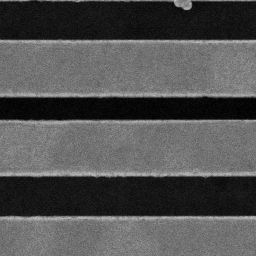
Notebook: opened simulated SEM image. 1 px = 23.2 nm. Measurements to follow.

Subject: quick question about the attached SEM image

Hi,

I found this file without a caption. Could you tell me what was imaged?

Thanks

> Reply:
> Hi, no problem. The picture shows lines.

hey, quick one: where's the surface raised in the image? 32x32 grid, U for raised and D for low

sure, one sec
DDDDDDDDDDDDDDDDDDDDDDUUDDDDDDDD
DDDDDDDDDDDDDDDDDDDDDDDDDDDDDDDD
DDDDDDDDDDDDDDDDDDDDDDDDDDDDDDDD
DDDDDDDDDDDDDDDDDDDDDDDDDDDDDDDD
DDDDDDDDDDDDDDDDDDDDDDDDDDDDDDDD
UUUUUUUUUUUUUUUUUUUUUUUUUUUUUUUU
UUUUUUUUUUUUUUUUUUUUUUUUUUUUUUUU
UUUUUUUUUUUUUUUUUUUUUUUUUUUUUUUU
UUUUUUUUUUUUUUUUUUUUUUUUUUUUUUUU
UUUUUUUUUUUUUUUUUUUUUUUUUUUUUUUU
UUUUUUUUUUUUUUUUUUUUUUUUUUUUUUUU
UUUUUUUUUUUUUUUUUUUUUUUUUUUUUUUU
DDDDDDDDDDDDDDDDDDDDDDDDDDDDDDDD
DDDDDDDDDDDDDDDDDDDDDDDDDDDDDDDD
DDDDDDDDDDDDDDDDDDDDDDDDDDDDDDDD
UUUUUUUUUUUUUUUUUUUUUUUUUUUUUUUU
UUUUUUUUUUUUUUUUUUUUUUUUUUUUUUUU
UUUUUUUUUUUUUUUUUUUUUUUUUUUUUUUU
UUUUUUUUUUUUUUUUUUUUUUUUUUUUUUUU
UUUUUUUUUUUUUUUUUUUUUUUUUUUUUUUU
UUUUUUUUUUUUUUUUUUUUUUUUUUUUUUUU
UUUUUUUUUUUUUUUUUUUUUUUUUUUUUUUU
DDDDDDDDDDDDDDDDDDDDDDDDDDDDDDDD
DDDDDDDDDDDDDDDDDDDDDDDDDDDDDDDD
DDDDDDDDDDDDDDDDDDDDDDDDDDDDDDDD
DDDDDDDDDDDDDDDDDDDDDDDDDDDDDDDD
DDDDDDDDDDDDDDDDDDDDDDDDDDDDDDDD
UUUUUUUUUUUUUUUUUUUUUUUUUUUUUUUU
UUUUUUUUUUUUUUUUUUUUUUUUUUUUUUUU
UUUUUUUUUUUUUUUUUUUUUUUUUUUUUUUU
UUUUUUUUUUUUUUUUUUUUUUUUUUUUUUUU
UUUUUUUUUUUUUUUUUUUUUUUUUUUUUUUU